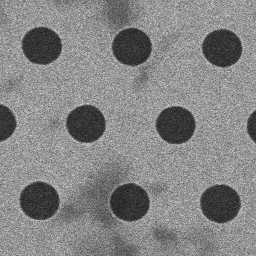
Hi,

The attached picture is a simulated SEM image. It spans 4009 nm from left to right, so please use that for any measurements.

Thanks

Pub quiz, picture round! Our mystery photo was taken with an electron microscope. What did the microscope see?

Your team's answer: a regular array of holes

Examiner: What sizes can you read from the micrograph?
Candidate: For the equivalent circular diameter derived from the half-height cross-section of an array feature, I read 617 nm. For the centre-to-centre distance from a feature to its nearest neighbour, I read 1400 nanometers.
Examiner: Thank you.